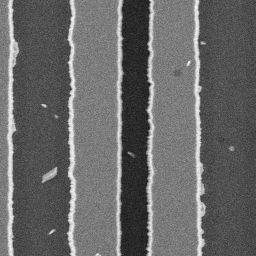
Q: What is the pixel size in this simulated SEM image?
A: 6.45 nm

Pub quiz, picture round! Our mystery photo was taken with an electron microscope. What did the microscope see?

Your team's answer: lines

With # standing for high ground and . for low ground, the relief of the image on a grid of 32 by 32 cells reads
##.......######....######.......
##.......######....######.......
##.......######....######.......
##.......######....######.......
##.......######....######.......
##.......######....######.......
##.......######....######.......
##.......######....######.......
##.......######....######.......
##.......######....######.......
##.......######....######.......
##.......######....######.......
##.......######....######.......
##.......######....######.......
##.......######....######.......
##.......######....######.......
##.......######....######.......
#........######....######.......
##.......######....######.......
##.......######...#######.......
##.......######....######.......
#........######....######.......
##.......######....######.......
##.......######...#######.......
#........######...#######.......
#........######....######.......
##.......######....######.......
##.......######....######.......
#........######....######.......
#........######....######.......
##.......######....######.......
##.......######...#######.......